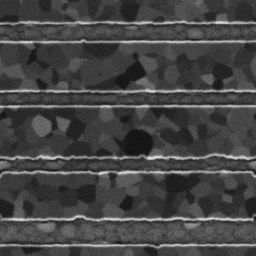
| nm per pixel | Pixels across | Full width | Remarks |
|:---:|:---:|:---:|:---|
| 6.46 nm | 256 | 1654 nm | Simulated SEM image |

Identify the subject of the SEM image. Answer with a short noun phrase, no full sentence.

one or a few lines or trenches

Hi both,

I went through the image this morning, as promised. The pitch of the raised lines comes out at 64.6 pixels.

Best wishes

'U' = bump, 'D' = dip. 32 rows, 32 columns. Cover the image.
UUUUUUUUUUUUUUUUUUUUUUUUUUUUUUUU
UUUUUUUUUUUUUUUUUUUUUUUUUUUUUUUU
UUUUUUUUUUUUUUUUUUUUUUUUUUUUUUUU
DDDDDDDDDDDDDDDDDDDDDDDDDDDDDDDD
DDDDDDDDDDDDDDDDDDDDDDDDDDDDDDDD
UUUUUUUUUUUUUUUUUUUUUUUUUUUUUUUU
UUUUUUUUUUUUUUUUUUUUUUUUUUUUUUUU
UUUUUUUUUUUUUUUUUUUUUUUUUUUUUUUU
UUUUUUUUUUUUUUUUUUUUUUUUUUUUUUUU
UUUUUUUUUUUUUUUUUUUUUUUUUUUUUUUU
UUUUUUUUUUUUUUUUUUUUUUUUUUUUUUUU
DDDDDDDDDDDDUUDDDDDDDDDDDDDDDDDD
DDDDDDDDDDDDDDDDDDDDDDDDDDDDDDDD
UUUUUUUUUUUUUUUUUUUUUUUUUUUUUUUU
UUUUUUUUUUUUUUUUUUUUUUUUUUUUUUUU
UUUUUUUUUUUUUUUUUUUUUUUUUUUUUUUU
UUUUUUUUUUUUUUUUUUUUUUUUUUUUUUUU
UUUUUUUUUUUUUUUUUUUUUUUUUUUUUUUU
UUUUUUUUUUUUUUUUUUUUUUUUUUUUUUUU
UUUUUUUUUUUUUUUUUUUUUUUUUUDDUUUU
DDDDDDDDDDDDDDDDDDDDDDDDDDDDDDDD
DDDDUUDDDDDDDUDDDDDDDDDDDUDUDDDD
UUUUUUUUUUUUUUUUUUUUUUUUUUUUUUUU
UUUUUUUUUUUUUUUUUUUUUUUUUUUUUUUU
UUUUUUUUUUUUUUUUUUUUUUUUUUUUUUUU
UUUUUUUUUUUUUUUUUUUUUUUUUUUUUUUU
UUUUUUUUUUUUUUUUUUUUUUUUUUUUUUUU
DDDDDDDDDDDDDDDDDDDDDDDDDDDDDDDD
DDDDDDDDDDDDDDDDDDDDDDDDDDDDDDDD
DDDDDDDDDDDDDDDDDDDDDDDDDDDDDDDD
DDDDDDDDDDDDDDDDDDDDDDDDDDDDDDDD
UUUUUUUUUUUUUUUUUUUUUUUUUUUUUUUU